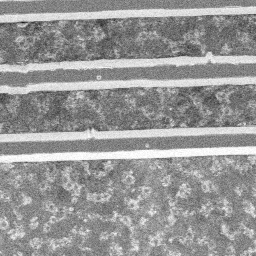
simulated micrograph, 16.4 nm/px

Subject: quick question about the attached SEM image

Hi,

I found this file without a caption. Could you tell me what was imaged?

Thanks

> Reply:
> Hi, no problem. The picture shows one or a few lines or trenches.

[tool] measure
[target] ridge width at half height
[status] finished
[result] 336 nanometres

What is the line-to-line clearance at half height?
822 nanometers